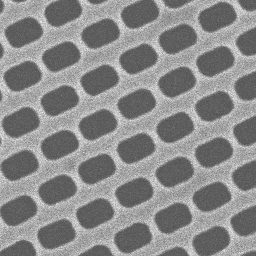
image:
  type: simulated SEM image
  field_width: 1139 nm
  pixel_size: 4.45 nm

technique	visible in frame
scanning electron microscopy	a regular array of holes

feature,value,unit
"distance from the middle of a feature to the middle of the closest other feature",195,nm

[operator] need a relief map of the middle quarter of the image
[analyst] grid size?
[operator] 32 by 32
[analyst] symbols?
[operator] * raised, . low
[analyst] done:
..*******..***........**********
*******......**.....*******.....
*****........***..********......
****..........**********........
****..........*********.........
.***.........***********........
...**......*******...***.......*
...***...*******......***....***
....**********.........*********
....*********..........*********
...**********..........*********
.********..***........**********
*******.....**......********...*
*****........**...********......
****.........***********........
****.........**********.........
****.........**********.........
..**.......********..**........*
...**...********......**......**
....**********........***..*****
....*********..........*********
...**********..........*********
.********..**.........**********
*******.....**......********..**
*****.......***...********......
****.........***********........
***..........**********.........
****........***********.........
..**.......*******..***.........
...**...********.....***......**
...***********........***...****
...**********.........**********